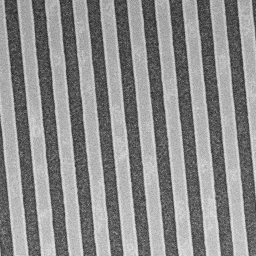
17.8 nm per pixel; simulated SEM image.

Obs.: parallel lines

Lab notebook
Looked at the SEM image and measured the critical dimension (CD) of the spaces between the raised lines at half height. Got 268 nm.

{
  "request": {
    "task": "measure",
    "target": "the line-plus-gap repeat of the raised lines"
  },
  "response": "488 nm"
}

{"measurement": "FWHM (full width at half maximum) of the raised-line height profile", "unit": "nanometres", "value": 224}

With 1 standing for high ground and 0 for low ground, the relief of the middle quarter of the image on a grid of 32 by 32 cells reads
00001110000111000011000011100001
00001110000111000011100001110000
00001110000111000011100001110000
00001110000111000011100001110000
00001110000111000011100001110000
10001110000111000011100001110000
10001110000111000011100001110000
10001111000111000011100001110000
10000111000011100011100001110000
10000111000011100001110001110000
10000111000011100001110001110000
10000111000011100001110000110000
10000111000011100001110000111000
10000111000011100001110000111000
10000111000011100001110000111000
10000111000011100001110000111000
11000011000011100001110000111000
11000011000011100001110000111000
11000011100011100001110000111000
11000011100001110001111000111000
11000011100001110001111000011000
11000011100001110000111000111000
11000011100001110000111000011100
11000011100001110000111000011100
11000011100001110000111000011100
11000011100001110000111000011100
11100011100001110000111000011100
11100001110001110000111000011100
11100001110001110000111000011100
11100001110000111000111000011100
11100001110000111000011100011100
11100001110000111000011100011100